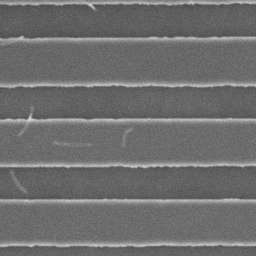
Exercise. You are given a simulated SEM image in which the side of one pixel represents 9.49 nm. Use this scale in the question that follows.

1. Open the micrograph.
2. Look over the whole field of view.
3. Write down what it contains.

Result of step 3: lines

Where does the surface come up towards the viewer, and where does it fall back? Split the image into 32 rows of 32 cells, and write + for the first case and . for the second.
.++++..+...+.......+++..........
................................
................................
................................
................................
++++++++++++++++++++++++++++++++
++++++++++++++++++++++++++++++++
++++++++++++++++++++++++++++++++
++++++++++++++++++++++++++++++++
++++++++++++++++++++++++++++++++
++++++++++++++++++++++++++++++++
................................
................................
................................
................................
++++++++++++++++++++++++++++++++
++++++++++++++++++++++++++++++++
++++++++++++++++++++++++++++++++
++++++++++++++++++++++++++++++++
++++++++++++++++++++++++++++++++
++++++++++++++++++++++++++++++++
................................
................................
................................
................................
++++++++++++++++++++++++++++++++
++++++++++++++++++++++++++++++++
++++++++++++++++++++++++++++++++
++++++++++++++++++++++++++++++++
++++++++++++++++++++++++++++++++
++++++++++++++++++++++++++++++++
................................